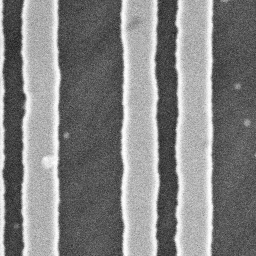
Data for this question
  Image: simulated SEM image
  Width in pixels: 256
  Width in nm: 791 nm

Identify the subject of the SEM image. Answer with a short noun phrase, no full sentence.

lines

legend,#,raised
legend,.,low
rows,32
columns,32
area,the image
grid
...####........#####..####......
...####........#####..####......
...####........#####..####......
...####........#####..####......
...####........#####..####......
...####........#####..####......
...####.........###...####......
#..####........####...####......
...####.........###...####......
...####.........###...####......
...####........#####..####......
#..####........#####..####......
...####........#####..####......
...####........#####..####......
...####.........####..####......
...####........#####..####......
#..####........#####..####......
...####........#####..####......
...####........#####..####......
#..####........#####..####......
...####........#####..####......
...####.........####..####......
...####........#####..####......
#..####........#####..####......
#..####........#####..####......
#..####........#####..####......
#..####........#####..####......
#..####........#####..####......
#..####.........####..####......
...####........#####..####......
...####........#####..####......
#..####........#####..####......